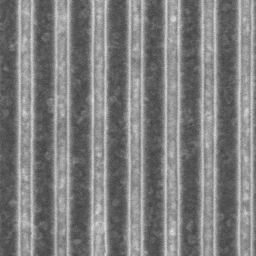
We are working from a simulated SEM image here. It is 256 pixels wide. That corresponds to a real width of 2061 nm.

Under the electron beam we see parallel lines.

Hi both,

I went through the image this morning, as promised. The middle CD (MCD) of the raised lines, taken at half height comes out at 201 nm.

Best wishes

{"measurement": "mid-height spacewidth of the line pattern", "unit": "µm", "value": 0.0896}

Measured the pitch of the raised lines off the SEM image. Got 0.295 um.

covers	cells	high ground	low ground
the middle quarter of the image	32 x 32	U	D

DUUUUUUDDDUUUUUUDDDUUUUUUDDDDUUU
DUUUUUUDDDUUUUUUDDDUUUUUUDDDDUUU
DUUUUUUDDDUUUUUUDDDUUUUUUDDDDUUU
DUUUUUUDDDUUUUUUDDDUUUUUUDDDDUUU
DUUUUUUDDDUUUUUUDDDUUUUUUDDDDUUU
DUUUUUUDDDUUUUUUDDDUUUUUUDDDDUUU
DUUUUUUDDDUUUUUUDDDUUUUUUDDDDUUU
DUUUUUUDDDUUUUUUDDDUUUUUUDDDDUUU
DUUUUUUDDDUUUUUUDDDUUUUUUDDDDUUU
DUUUUUUDDDUUUUUUDDDUUUUUUDDDDUUU
DUUUUUUDDDUUUUUUDDDUUUUUUDDDDUUU
DUUUUUUDDDUUUUUUDDDUUUUUUDDDDUUU
DUUUUUUDDDUUUUUUDDDUUUUUUDDDDUUU
DUUUUUUDDDUUUUUUDDDUUUUUUDDDDUUU
DUUUUUUDDDUUUUUUDDDUUUUUUDDDDUUU
DUUUUUUDDDUUUUUUDDDUUUUUUDDDUUUU
DUUUUUUDDDUUUUUUDDDUUUUUUDDDUUUU
DUUUUUUDDDUUUUUUDDDUUUUUUDDDUUUU
DUUUUUUDDDUUUUUUDDDUUUUUUDDDUUUU
DUUUUUUDDDUUUUUUDDDUUUUUUDDDUUUU
DUUUUUUDDDUUUUUUDDDUUUUUUDDDUUUU
DUUUUUUDDDUUUUUUDDDUUUUUUDDDUUUU
DUUUUUUDDDUUUUUUDDDUUUUUUDDDUUUU
DUUUUUUDDDUUUUUUDDDUUUUUUDDDUUUU
DUUUUUUDDDUUUUUUDDDUUUUUUDDDUUUU
DUUUUUUDDDUUUUUUDDDUUUUUUDDDUUUU
DUUUUUUDDDUUUUUUDDDUUUUUUDDDUUUU
DUUUUUUDDDUUUUUUDDDUUUUUUDDDUUUU
DUUUUUUDDDUUUUUUDDDUUUUUUDDDDUUU
DUUUUUUDDDUUUUUUDDDUUUUUUDDDDUUU
DUUUUUUDDDUUUUUUDDDUUUUUUDDDDUUU
DUUUUUUDDDUUUUUUDDDUUUUUUDDDDUUU